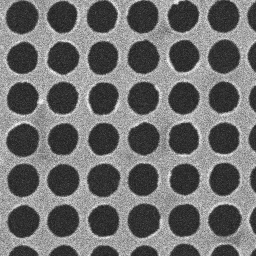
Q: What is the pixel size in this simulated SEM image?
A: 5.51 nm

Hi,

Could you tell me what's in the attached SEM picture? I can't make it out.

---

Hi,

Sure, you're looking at a regular array of holes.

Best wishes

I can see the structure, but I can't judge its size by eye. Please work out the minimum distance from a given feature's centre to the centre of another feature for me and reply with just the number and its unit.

220 nanometres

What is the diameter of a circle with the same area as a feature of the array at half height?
0.177 µm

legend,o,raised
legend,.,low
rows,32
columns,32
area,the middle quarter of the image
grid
...ooo.......ooo.......oooo.....
..ooooo.....ooooo......ooooo....
.ooooooo...oooooooo..ooooooooooo
oooooooooooooooooooooooooooooooo
ooooooooo..oooooooo..oooooooo..o
..oooooo.....oooo......oooo.....
...oooo......ooo.......oooo.....
....oo........oo........oo......
....oo........oo........oo......
...ooo.......ooo........oo......
...ooo.......ooo.......oooo.....
..ooooo.....ooooo......oooo.....
.ooooooo...oooooooo..oooooooo..o
oooooooooooooooooooooooooooooooo
oooooooooooooooooooooooooooooo.o
..oooooo....oooooo.....ooooo....
...oooo......ooo.......oooo.....
....oo........oo........oo......
....oo........oo........oo......
...ooo........oo........oo......
...ooo.......ooo.......ooo......
...oooo......oooo......oooo.....
.ooooooo...oooooooo...oooooo....
oooooooooooooooooooooooooooooooo
oooooooooooooooooooooooooooooooo
..oooooo....oooooo....oooooo....
...oooo......oooo......oooo.....
....oo........oo........ooo.....
....oo........oo........oo......
....oo........oo........oo......
....oo........oo.......oooo.....
...ooo.......oooo......oooo.....